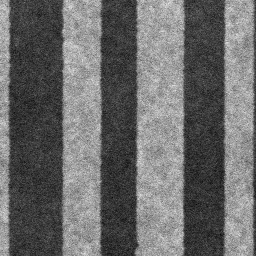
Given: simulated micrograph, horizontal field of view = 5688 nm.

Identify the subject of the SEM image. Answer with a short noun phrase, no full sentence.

one or a few lines or trenches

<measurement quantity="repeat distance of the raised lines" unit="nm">1750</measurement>